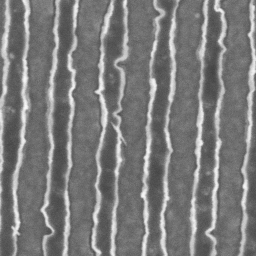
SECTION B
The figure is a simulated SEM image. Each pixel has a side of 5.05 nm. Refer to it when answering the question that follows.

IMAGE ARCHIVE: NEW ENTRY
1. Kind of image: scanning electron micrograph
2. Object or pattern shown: parallel lines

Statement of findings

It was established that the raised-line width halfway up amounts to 108 nm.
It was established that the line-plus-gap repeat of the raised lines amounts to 248 nanometres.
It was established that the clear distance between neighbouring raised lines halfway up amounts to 141 nanometres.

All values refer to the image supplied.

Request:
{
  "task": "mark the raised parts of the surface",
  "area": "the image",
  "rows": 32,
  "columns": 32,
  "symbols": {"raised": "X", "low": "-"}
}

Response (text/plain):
-XX----XXX----XX---XXX----X----X
-XXX---XXX----XX----XX----XX----
-XX----XXX---XXX----XX----XX---X
-XXX---XX----XXX----XX---XXX---X
-XX----XX----XXX---XXX---XXX---X
-XX----XX----XXX---XXX---XXX---X
XXX----XX----XXX---XXX---XXX----
-XX----XX----XX----XXX---XXX----
-XX----XX----XX----XXX---XXX---X
-XX---XXX----XX----XXX---XXX---X
XXX---XXX---XXX----XXX---XXX---X
XXX---XXX---XXX----XXX---XXX---X
XXX---XXX----XX----XX----XXX---X
XXX---XXX----XX----XX----XX----X
XXX---XXX----XX----XX----XX----X
XXX---XXX----XX---XXX----XX----X
XXX---XXX----XX---XXX----XX----X
XXX---XXX----XX----XX----XX----X
XXX---XXX---XXX---XXX----XX----X
XXX---XXX---XXX---XXX----XX----X
XXX---XXX---XXX---XXX----XX----X
XX----XXX---XXX---XXX---XXX---XX
XX----XX----XXX---XXX---XXX----X
XX----XX----XXX---XXX---XXX---XX
XX----XX----XXX---XXX---XXX---XX
XX----XXX---XXX---XXX---XXX---XX
XX---XXXX---XX----XX----XXX---XX
XX----XXX---XX----XX----XXX----X
XX----XXX---XX----XXX---XXX---XX
XX----XX----XX----XXX---XX----XX
XX---XXX----XX----XX----XXX---XX
XX---XXX----XX----XXX---XXX---XX